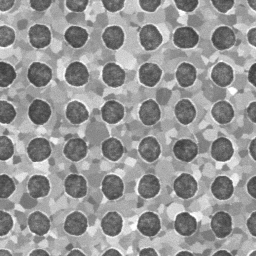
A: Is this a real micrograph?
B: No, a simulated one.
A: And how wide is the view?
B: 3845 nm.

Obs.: a regular array of holes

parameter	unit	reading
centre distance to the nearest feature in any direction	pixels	36.4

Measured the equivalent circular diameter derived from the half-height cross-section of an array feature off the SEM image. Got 366 nanometers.